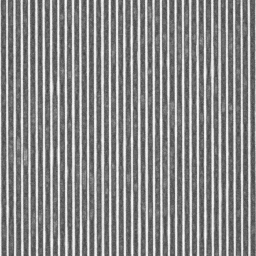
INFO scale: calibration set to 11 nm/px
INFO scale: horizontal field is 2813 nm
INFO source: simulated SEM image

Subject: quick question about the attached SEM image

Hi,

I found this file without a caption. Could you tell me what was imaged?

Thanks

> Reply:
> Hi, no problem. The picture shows parallel lines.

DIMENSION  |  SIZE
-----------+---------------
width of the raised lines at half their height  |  20.6 nm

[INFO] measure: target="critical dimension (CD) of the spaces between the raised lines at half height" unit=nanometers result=61.8